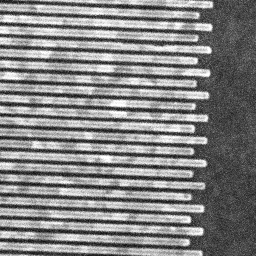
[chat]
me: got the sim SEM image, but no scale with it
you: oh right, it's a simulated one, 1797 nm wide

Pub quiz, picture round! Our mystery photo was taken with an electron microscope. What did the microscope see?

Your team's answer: parallel lines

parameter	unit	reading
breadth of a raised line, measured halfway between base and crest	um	0.0394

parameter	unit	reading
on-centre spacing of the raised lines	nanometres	79.7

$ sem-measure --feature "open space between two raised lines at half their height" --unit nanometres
40.3